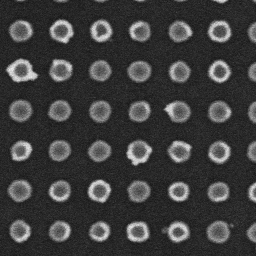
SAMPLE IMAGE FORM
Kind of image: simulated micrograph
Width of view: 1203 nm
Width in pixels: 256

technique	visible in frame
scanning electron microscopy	a regular array of raised bodies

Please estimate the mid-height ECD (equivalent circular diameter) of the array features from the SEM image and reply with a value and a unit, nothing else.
21.5 px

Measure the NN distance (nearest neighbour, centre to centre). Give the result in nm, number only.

185